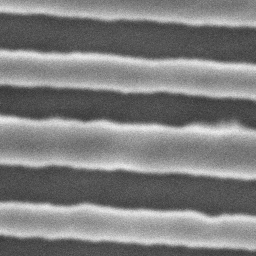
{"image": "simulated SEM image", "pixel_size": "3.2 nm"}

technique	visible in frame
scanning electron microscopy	lines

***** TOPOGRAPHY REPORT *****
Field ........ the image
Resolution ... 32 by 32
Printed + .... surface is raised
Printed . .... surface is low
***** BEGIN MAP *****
++++++++++++++++++++++++++++++++
..++++++++++++++++++++++++++++++
....................++++++++++++
................................
................................
................................
................................
++++++++++++++++................
++++++++++++++++++++++++++++++++
++++++++++++++++++++++++++++++++
.+++++++++++++++++++++++++++++++
.......................+++++++++
................................
................................
................................
+++++++++++++...................
+++++++++++++++++++++++++++++++.
++++++++++++++++++++++++++++++++
++++++++++++++++++++++++++++++++
++++++++++++++++++++++++++++++++
...+++.+++++++++++++++++++++++++
...................++..+++++++++
................................
................................
................................
................................
++++++++++++++++................
++++++++++++++++++++++++++++++++
++++++++++++++++++++++++++++++++
..++++++++++++++++++++++++++++++
.......................+++++++++
................................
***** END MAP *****